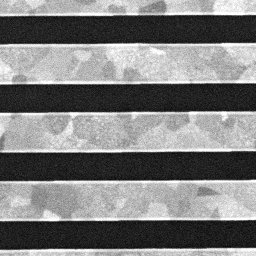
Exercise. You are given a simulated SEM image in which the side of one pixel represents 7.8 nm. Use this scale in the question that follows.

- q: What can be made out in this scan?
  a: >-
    wiring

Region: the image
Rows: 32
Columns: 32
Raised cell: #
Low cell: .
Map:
################################
################################
................................
................................
................................
..............................##
################################
################################
################################
################################
................................
................................
................................
................................
################################
################################
################################
################################
################################
................................
................................
................................
................................
################################
################################
################################
################################
############....................
................................
................................
................................
################################